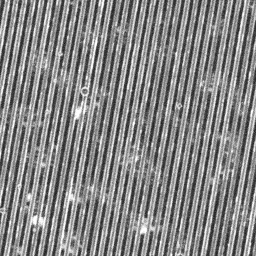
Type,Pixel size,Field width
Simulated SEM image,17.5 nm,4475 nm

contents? parallel lines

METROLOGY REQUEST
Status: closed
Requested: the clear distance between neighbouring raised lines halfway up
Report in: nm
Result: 56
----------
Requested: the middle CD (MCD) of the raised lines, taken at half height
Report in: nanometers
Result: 88.3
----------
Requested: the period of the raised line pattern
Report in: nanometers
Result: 148